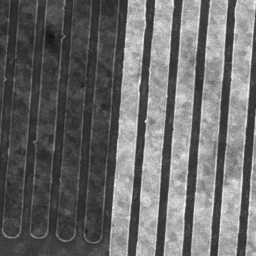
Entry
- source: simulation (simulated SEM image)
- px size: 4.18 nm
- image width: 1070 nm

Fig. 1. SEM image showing parallel lines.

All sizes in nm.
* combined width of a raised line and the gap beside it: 113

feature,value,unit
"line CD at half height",74.1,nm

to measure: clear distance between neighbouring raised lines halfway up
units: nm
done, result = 39.1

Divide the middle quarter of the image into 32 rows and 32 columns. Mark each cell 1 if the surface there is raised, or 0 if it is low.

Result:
01111100111100011110001111000111
01111100111100011110011111000111
01111100111100011110001111000111
01111000111100011110001111000111
01111000111100011110011111001111
01111000111100011110011111001111
01111000111100011110011111001111
01111000111100111110011111001111
01111000111100111110011111001111
01111000111100111110011111001111
01111001111100111100011110001111
01111001111100111100011110001111
01111001111100111100011110001111
11111001111000111100011110001111
11111001111000111100111110001111
11111001111000111100011110001111
11110001111000111100011110011111
11110001111000111100111110011110
11110001111000111100111110011110
11110001111000111100111110011110
11110001111001111100111100011110
11110001111001111100111100011110
11110001111001111100111100011110
11110011111001111000111100011110
11110011111001111000111100011110
11110011111001111000111100011110
11110011111001111000111100011110
11110011110001111000111100011110
11110011110001111000111100011110
11110011110001111000111100011110
11100011110001111000111100011110
11100011110001111001111100111100